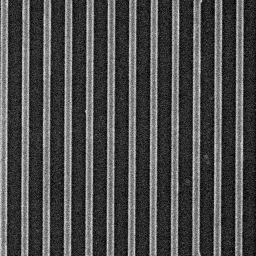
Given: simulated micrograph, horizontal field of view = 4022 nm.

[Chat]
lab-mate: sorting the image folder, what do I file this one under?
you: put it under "parallel lines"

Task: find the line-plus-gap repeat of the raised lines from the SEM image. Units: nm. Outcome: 336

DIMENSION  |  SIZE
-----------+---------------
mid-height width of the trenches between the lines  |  15.1 px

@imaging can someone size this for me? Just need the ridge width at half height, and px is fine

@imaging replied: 6.38